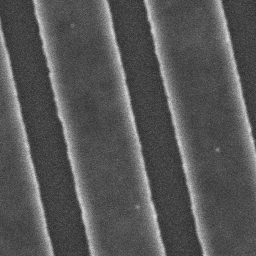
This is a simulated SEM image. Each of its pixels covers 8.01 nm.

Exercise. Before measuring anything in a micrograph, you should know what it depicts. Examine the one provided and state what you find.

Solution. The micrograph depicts lines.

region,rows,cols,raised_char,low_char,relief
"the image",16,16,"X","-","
--XXXXX--XXXXX--
--XXXXX--XXXXX--
---XXXX---XXXX--
X--XXXX---XXXXX-
X--XXXXX--XXXXX-
X--XXXXX--XXXXX-
X---XXXX---XXXX-
X---XXXX---XXXX-
XX--XXXXX--XXXXX
XX--XXXXX--XXXXX
XX---XXXX---XXXX
XX---XXXX---XXXX
XXX--XXXX---XXXX
XXX--XXXXX--XXXX
XXX--XXXXX--XXXX
XXX---XXXX---XXX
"